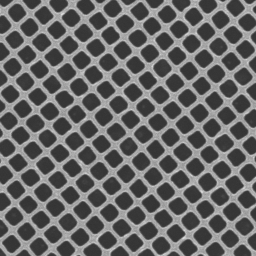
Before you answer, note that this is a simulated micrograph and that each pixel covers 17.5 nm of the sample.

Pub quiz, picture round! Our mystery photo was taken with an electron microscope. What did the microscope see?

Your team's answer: a regular array of holes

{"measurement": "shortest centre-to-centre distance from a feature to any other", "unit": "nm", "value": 331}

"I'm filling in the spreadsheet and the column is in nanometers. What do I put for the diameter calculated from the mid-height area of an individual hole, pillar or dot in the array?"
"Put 303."